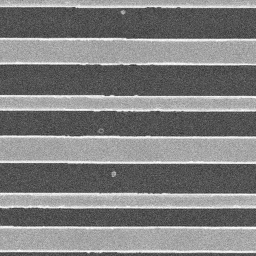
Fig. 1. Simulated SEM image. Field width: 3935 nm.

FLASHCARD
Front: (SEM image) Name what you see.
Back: lines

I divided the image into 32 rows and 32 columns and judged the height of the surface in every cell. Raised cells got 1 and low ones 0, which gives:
11111111111111111111111111111111
00000000000000000000000000000000
00000000000000000000000000000000
00000000000000000000000000000000
00000000000000000000000000000000
11111111111111111111111111111111
11111111111111111111111111111111
11111111111111111111111111111111
00000000000000000000000000000000
00000000000000000000000000000000
00000000000000000000000000000000
00000000000000000000000000000000
11111111111111111111111111111111
11111111111111111111111111111111
00000000000000000000000000000000
00000000000000000000000000000000
00000000000000000000000000000000
11111111111111111111111111111111
11111111111111111111111111111111
11111111111111111111111111111111
00000000000000000000000000000000
00000000000000000000000000000000
00000000000000000000000000000000
00000000000000000000000000000000
11111111111111111111111111111111
11111111111111111111111111111111
00000000000000000000000000000000
00000000000000000000000000000000
11111111110000000011111100000000
11111111111111111111111111111111
11111111111111111111111111111111
00000000000000000000000000000000